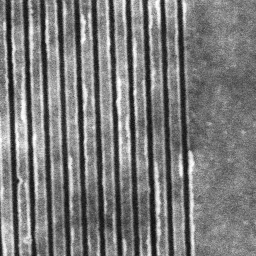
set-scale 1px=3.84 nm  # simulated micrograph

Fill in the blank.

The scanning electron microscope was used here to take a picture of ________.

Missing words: parallel lines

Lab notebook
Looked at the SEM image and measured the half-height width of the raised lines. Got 40.8 nanometers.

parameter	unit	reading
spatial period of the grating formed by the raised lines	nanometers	65.8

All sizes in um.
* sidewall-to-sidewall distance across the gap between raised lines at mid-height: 0.0259